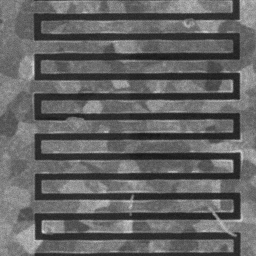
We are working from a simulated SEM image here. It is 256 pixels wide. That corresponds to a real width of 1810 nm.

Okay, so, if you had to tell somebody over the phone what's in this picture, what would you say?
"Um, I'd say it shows groups of lines, slits or small figures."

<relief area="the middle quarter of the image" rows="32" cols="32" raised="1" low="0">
11111111111111111111111111111111
11111111111111111111111111111111
00000000000000000000000000000000
00000000000000000000000000000000
11111111111111111111111111111111
11111111111111111111111111111111
11111111111111111111111111111111
00000000000000000000000000000000
00000000000000000000000000000000
11111111111111111111111111111111
11111111111111111111111111111111
11111111111111111111111111111111
00000000000000000000000000000000
01100000000000000000000000000000
11111111111111110111111111111111
11111111111111111111111111111111
11111111111111111111111111111111
00000000000000000000000000000000
00000000000000000000000000000000
11111111111111111111111111111111
11111111111111111111111111111111
11111111111111111111111111111111
00000000000000000000000000000000
00000000000000000000000000000000
11111111111111111111111111111111
11111111111111111111111111111111
11111111111111111111111111111111
00000000000000000000000000000000
00000000000000000000000000000000
11111111111111111111111111111111
11111111111111111111111111111111
11111111111111111111111111111111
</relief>